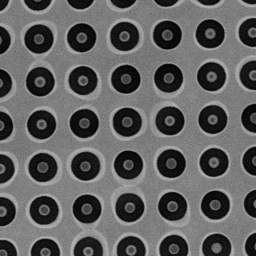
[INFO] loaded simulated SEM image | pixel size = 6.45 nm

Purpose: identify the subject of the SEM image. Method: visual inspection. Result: an array of small figures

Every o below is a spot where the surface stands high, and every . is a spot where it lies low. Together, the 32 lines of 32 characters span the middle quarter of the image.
oooo.ooooooooo...ooooooo....oooo
oo......oooo......ooooo......ooo
o.......oooo.......oooo...o...oo
o...oo...oo...ooo..ooo...oo...oo
o...oo...oo....o...oooo..oo...oo
o........ooo.......oooo.......oo
oo......ooooo.....ooooo......ooo
ooo.....ooooooo.ooooooooo..ooooo
oooooooooooooooooooooooooooooooo
oooooooooooooooooooooooooooooooo
oooooooooooooooooooooooo....oooo
oooo...oooooo.....ooooo......ooo
oo......oooo.......oooo.......oo
o........ooo...o....oo....o...oo
o...oo...ooo...oo...oo....o...oo
o...oo...ooo...o....oo........oo
oo......oooo........ooo.......oo
oo......ooooo.....oooooo....oooo
ooo...oooooooo..oooooooooooooooo
oooooooooooooooooooooooooooooooo
oooooooooooooooooooooooooooooooo
ooooo..oooooooooooooooooo....ooo
oo......oooooo.....ooooo......oo
oo.......oooo......oooo.......oo
o....o....oo...oo...ooo...oo..oo
o...oo....oo...oo...ooo...oo..oo
o....o....oo........ooo.......oo
oo.......oooo......ooooo.....ooo
ooo.....oooooo.....oooooo...oooo
oooooooooooooooo.ooooooooooooooo
oooooooooooooooooooooooooooooooo
ooooooooooooooo..ooooooooooooooo